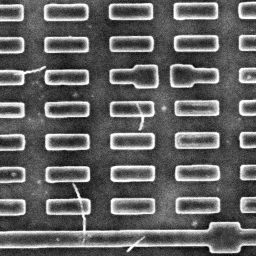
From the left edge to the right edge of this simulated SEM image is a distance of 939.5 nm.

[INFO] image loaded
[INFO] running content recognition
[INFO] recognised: wiring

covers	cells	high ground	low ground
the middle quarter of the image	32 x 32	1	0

00000000000000000011111000011111
00000000000011111111111000011111
11111100000011111111111000011111
11111100000011111111111000011111
11111100000011111111111000011111
00000000000000000011111000011111
00000000000000000000000000000000
00000000000000000000000000000000
00000000000000000000000000000000
00000000000000000000000000001111
11111100000011111111110000001111
11111100000011111111110000001111
11111100000011111111110000001111
00000000000000000001000000000000
00000000000000000000000000000000
00000000000000000000000000000000
00000000000000000000000000000000
00000000000011111111110000001111
11111100000011111111110000001111
11111100000011111111110000001111
11111100000011111111110000001111
00000000000000000000000000000000
00000000000000000000000000000000
00000000000000000000000000000000
00000000000000000000000000000000
00000000000000000000000000000000
11111100000011111111110000001111
11111100000011111111110000001111
11111100000011111111110000001111
00000000000000000000000000000000
00000000000000000000000000000000
00000000000000000000000000000000